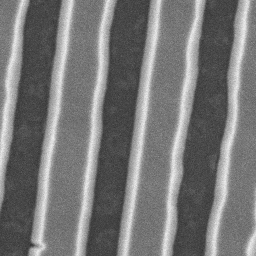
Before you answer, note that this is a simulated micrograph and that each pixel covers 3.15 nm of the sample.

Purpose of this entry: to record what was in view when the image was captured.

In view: one or a few lines or trenches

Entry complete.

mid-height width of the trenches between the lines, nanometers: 128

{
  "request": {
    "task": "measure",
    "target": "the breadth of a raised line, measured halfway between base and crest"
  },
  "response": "147 nm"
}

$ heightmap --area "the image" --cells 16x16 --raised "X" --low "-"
XX--XXX---XXX--X
X---XXX--XXX---X
X---XXX--XXX---X
X---XXX--XXX---X
X---XXX--XXX---X
X--XXX---XXX--XX
X--XXX---XXX--XX
X--XXX---XXX--XX
---XXX---XX---XX
---XXX--XXX---XX
---XXX--XXX---XX
---XXX--XXX---XX
---XXX--XXX---XX
--XXX---XXX--XXX
--XXX---XXX--XXX
--XXX---XXX--XXX